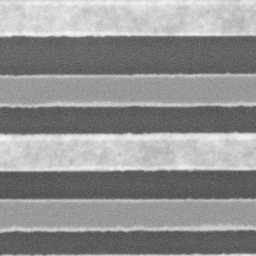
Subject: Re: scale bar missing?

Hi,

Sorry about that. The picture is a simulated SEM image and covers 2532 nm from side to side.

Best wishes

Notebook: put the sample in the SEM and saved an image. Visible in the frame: lines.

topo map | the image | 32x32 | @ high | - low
@@@@@@@@@@@@@@@@@@@@@@@@@@@@@@@@
@@@@@@@@@@@@@@@@@@@@@@@@@@@@@@@@
@@@@@@@@@@@@@@@@@@@@@@@@@@@@@@@@
@@@@@@@@@@@@@@@@@@@@@@@@@@@@@@@@
--------------------------------
--------------------------------
--------------------------------
--------------------------------
--------------------------------
--@@@@@@@@@@@@@@@@@@@@@@@@@@@@@@
@@@@@@@@@@@@@@@@@@@@@@@@@@@@@@@@
@@@@@@@@@@@@@@@@@@@@@@@@@@@@@@@@
@@@@@@@@@@@@@@@@@@@@@@@@@@@@@@@@
--------------------------------
--------------------------------
--------------------------------
--------------------------------
@@@@@@@@@@@@@@@@@@@@@@@@@@@@@@@@
@@@@@@@@@@@@@@@@@@@@@@@@@@@@@@@@
@@@@@@@@@@@@@@@@@@@@@@@@@@@@@@@@
@@@@@@@@@@@@@@@@@@@@@@@@@@@@@@@@
--------------------------------
--------------------------------
--------------------------------
--------------------------------
@@@@@@@@@@@@@@@@@@@@@@@@@@@@@@@@
@@@@@@@@@@@@@@@@@@@@@@@@@@@@@@@@
@@@@@@@@@@@@@@@@@@@@@@@@@@@@@@@@
@@@@@@@@@@@@@@@@@@@@@@@@@@@@@@@@
--------------------------------
--------------------------------
--------------------------------